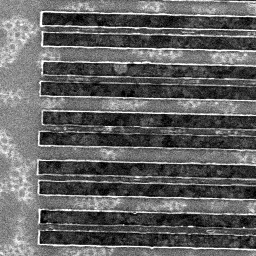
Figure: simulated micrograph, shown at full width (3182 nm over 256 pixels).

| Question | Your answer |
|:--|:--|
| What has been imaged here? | parallel lines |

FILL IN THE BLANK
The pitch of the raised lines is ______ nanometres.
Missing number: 302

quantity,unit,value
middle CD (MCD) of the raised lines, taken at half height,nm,171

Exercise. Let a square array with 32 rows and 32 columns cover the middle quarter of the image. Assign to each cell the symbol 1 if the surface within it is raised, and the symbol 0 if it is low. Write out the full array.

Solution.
11111111111111111111111111111111
11111111111111111111111111111111
11111111111111111111111111111111
00000000000000000000000000000000
00000000000000000000000000000000
11111111111111111111111111111111
11111111111111111111111111111111
11111111111111111111111111111111
00000000000000000111111111111111
00000000000000000000000000000000
00000000000000000000000000000000
00000000000000000000000000000000
11111111111111111111110111000001
11111111111111111111111111111111
11111111111111111111111111111111
00000000000000111111111111111111
00000000000000000000000000000000
11111111111111110000000000000000
11111111111111111111111111111111
11111111111111111111111111111111
00001111111111111111111111111111
00000000000000000000000000000000
00000000000000000000000000000000
00000000000000000000000000000000
11111111111100000000000000000000
11111111111111111111111111111111
11111111111111111111111111111111
11111111111111111111111111111111
00000000000000000000000000000000
11111100000000000000000000000000
11111111111111111111111111111111
11111111111111111111111111111111